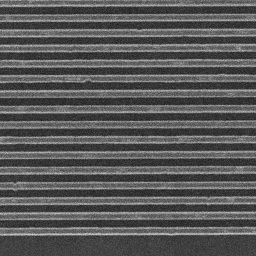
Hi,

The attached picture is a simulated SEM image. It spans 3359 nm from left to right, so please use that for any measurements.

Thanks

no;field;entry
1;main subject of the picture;parallel lines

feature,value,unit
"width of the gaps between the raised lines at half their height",0.115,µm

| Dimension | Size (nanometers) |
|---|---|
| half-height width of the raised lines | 77.1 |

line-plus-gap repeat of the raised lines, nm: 200